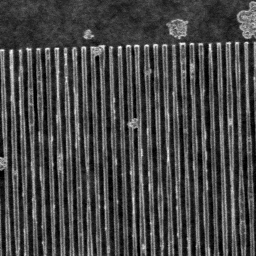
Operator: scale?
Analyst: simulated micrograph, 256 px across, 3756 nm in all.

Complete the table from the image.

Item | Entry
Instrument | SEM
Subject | parallel lines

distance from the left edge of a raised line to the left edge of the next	133	nm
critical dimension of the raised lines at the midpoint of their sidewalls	55	nm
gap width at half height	84.3	nanometers